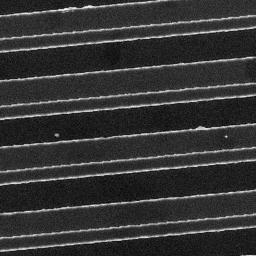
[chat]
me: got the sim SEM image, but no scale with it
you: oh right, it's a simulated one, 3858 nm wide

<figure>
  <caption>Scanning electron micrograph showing lines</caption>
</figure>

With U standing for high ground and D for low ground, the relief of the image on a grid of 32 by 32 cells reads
DDDDDDDDDDDDDDDDUUUUUUUUUUUUUUUU
DDDDDUUUUUUUUUUUUUUUUUUUUUUUUUUU
UUUUUUUUUUUUUUUUUUUUUUUUUUUUUUUU
UUUUUUUUUUUUUUUUUUUUUUUUUUUUUUUU
UUUUUUUUUUUUUUUUUUUUUDDDDDDDDDDD
UUUUUUUUUUUDDDDDDDDDDDDDDDDDDDDD
DDDDDDDDDDDDDDDDDDDDDDDDDDDDDDDD
DDDDDDDDDDDDDDDDDDDDDDDDDDDDDUUU
DDDDDDDDDDDDDDDDDDUUUUUUUUUUUUUU
DDDDDDDUUUUUUUUUUUUUUUUUUUUUUUUU
UUUUUUUUUUUUUUUUUUUUUUUUUUUUUUUU
UUUUUUUUUUUUUUUUUUUUUUUUUUUUUUUU
UUUUUUUUUUUUUUUUUUUUUUUUUUDDDDDD
UUUUUUUUUUUUUUUDDDDDDDDDDDDDDDDD
UUUUDDDDDDDDDDDDDDDDDDDDDDDDDDDD
DDDDDDDDDDDDDDDDDDDDDDDDDDDDDDDD
DDDDDDDDDDDDDDDDDDDDDDUUUUUUUUUU
DDDDDDDDDDUUUUUUUUUUUUUUUUUUUUUU
UUUUUUUUUUUUUUUUUUUUUUUUUUUUUUUU
UUUUUUUUUUUUUUUUUUUUUUUUUUUUUUUU
UUUUUUUUUUUUUUUUUUUUUUUUUUUDDDDD
UUUUUUUUUUUUUUUUDDDDDDDDDDDDDDDD
UUUUUUDDDDDDDDDDDDDDDDDDDDDDDDDD
DDDDDDDDDDDDDDDDDDDDDDDDDDDDDDDD
DDDDDDDDDDDDDDDDDDDDDDDDDUUUUUUU
DDDDDDDDDDDDDDUUUUUUUUUUUUUUUUUU
DDDUUUUUUUUUUUUUUUUUUUUUUUUUUUUU
UUUUUUUUUUUUUUUUUUUUUUUUUUUUUUUU
UUUUUUUUUUUUUUUUUUUUUUUUUUUUUUDD
UUUUUUUUUUUUUUUUUUUUDDDDDDDDDDDD
UUUUUUUUUDDDDDDDDDDDDDDDDDDDDDDD
DDDDDDDDDDDDDDDDDDDDDDDDDDDDDDDD